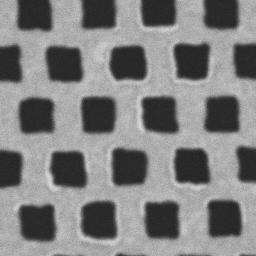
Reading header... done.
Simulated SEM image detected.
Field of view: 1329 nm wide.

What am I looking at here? a regular array of holes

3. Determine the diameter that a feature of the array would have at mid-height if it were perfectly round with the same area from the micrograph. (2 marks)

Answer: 0.201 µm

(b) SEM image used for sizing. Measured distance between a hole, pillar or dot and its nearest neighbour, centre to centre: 311 nanometres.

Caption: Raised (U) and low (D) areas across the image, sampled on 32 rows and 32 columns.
UUDDDDUUUUDDDDUUUUDDDDUUUDDDDDUU
UUDDDDUUUUDDDDUUUUDDDDUUUUDDDDUU
UUDDDDUUUUDDDDDUUUDDDDUUUDDDDDUU
UUDDDDUUUUUDDUUUUUUUUUUUUUDDDUUU
UUUUUUUUUUUUUUUUUUUUUUUUUUUUUUUU
UUUUUUUUUUUUUUUUUUUUUUDDUDUUUUUD
DDDUUUDDDDUUUUDDDDUUUUDDDDUUUDDD
DDDUUUDDDDUUUUDDDDUUUUDDDDUUUDDD
DDDUUUDDDDUUUUDDDDUUUUDDDDUUUDDD
DDDUUUDDDDUUUUDDDDUUUUDDDDUUUUDD
UUUUUUUUUUUUUUUUUUUUUUUUUUUUUUUU
UUUUUUUUUUUUUUUUUUUUUUUUUUUUUUUU
UUUDDDUUUUDDDDUUUUDDDDUUUUDDDDUU
UUDDDDDUUUDDDDUUUUDDDDUUUUDDDDUU
UUDDDDDUUUDDDDUUUUDDDDUUUUDDDDUU
UUUDDDDUUUDDDDUUUUDDDDUUUDDDDDUU
UUUDDDUUUUUDDDUUUUUUDDUUUUDDDUUU
UUUUUUUUUUUUUUUUUUUUUUUUUUUUUUUU
UUUUUUUUUUUUUUUUUUUUUUUUUUUUUUDD
DDDUUUUDDDUUUUDDDDUUUUDDDDUUUUDD
DDDUUUDDDDDUUUDDDDUUUUDDDDUUUUDD
DDDUUUDDDDDUUUDDDDUUUUDDDDUUUUDD
DDDUUUUDDDDUUUDDDDUUUUDDDDUUUUDD
UUUUUUUUUUUUUUUUUUUUUUUUUUUUUUUU
UUUUUUUUUUUUUUUUUUUUUUUUUUUUUUUU
UUUUUUUUUUUDDDUUUUDDDDUUUUDDDDUU
UUDDDDDUUUDDDDUUUUDDDDUUUUDDDDUU
UUDDDDDUUUDDDDUUUUDDDDUUUUDDDDUU
UUUDDDDUUUDDDDDUUUDDDDUUUUDDDDUU
UUUDDDDUUUUDDDUUUUUDDDUUUUDDDDUU
UUUUUUUUUUUUUUUUUUUUUUUUUUUUUUUU
UUUUUUUUUUUUUUUUUUUUUUUUUUUUUUUU